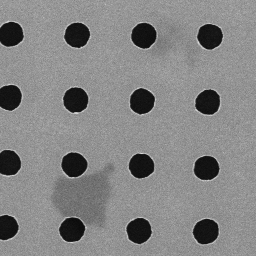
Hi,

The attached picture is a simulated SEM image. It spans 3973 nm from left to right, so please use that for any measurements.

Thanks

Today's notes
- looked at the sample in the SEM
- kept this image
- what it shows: a regular array of holes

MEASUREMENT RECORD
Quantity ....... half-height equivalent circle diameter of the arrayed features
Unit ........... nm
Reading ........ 396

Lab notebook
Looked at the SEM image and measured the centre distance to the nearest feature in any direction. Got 1000 nanometres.